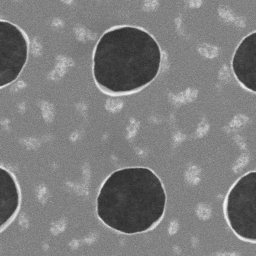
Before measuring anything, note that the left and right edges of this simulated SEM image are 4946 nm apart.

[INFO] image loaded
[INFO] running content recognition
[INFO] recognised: holes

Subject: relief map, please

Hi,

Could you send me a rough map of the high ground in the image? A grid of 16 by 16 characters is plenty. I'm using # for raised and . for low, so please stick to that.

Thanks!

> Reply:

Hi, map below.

################
.###############
..####....#####.
..####....#####.
.#####....#####.
######...#######
################
################
################
################
################
.######...#####.
.#####....####..
.#####....####..
########.######.
################